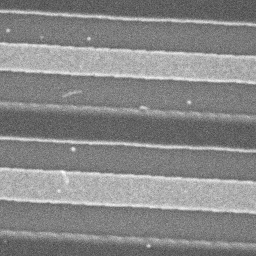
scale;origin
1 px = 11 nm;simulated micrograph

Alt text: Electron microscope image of lines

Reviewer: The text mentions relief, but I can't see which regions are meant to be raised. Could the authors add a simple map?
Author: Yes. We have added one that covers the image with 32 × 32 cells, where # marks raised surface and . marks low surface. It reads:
################################
..##############################
..................##############
................................
................................
#...............................
####################............
################################
################################
...............#################
................................
................................
................................
##########......................
###########################.....
################################
################################
....############################
.......................#########
................................
................................
########........................
###########################.....
################################
################################
...........#####################
..............................##
................................
................................
##########......................
###########################.....
################################